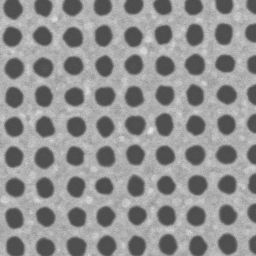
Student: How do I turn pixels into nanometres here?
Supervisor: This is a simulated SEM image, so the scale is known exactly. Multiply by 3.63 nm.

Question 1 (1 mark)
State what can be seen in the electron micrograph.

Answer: a regular array of holes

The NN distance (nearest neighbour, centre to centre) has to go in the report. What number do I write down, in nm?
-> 107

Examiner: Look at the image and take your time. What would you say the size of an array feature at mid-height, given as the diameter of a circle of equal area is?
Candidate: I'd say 69.9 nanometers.